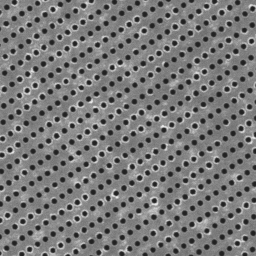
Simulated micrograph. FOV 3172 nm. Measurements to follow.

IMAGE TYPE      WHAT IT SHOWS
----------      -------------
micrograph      a regular array of holes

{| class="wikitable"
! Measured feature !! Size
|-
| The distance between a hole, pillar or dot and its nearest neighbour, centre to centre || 0.115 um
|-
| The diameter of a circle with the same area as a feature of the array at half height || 0.0726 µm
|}